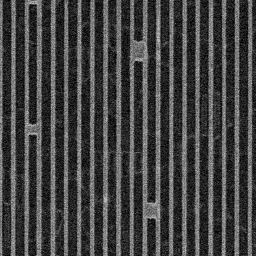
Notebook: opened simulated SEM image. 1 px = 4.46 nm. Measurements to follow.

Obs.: parallel lines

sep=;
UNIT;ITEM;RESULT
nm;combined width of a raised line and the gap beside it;58.5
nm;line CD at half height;15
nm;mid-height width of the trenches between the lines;41.8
